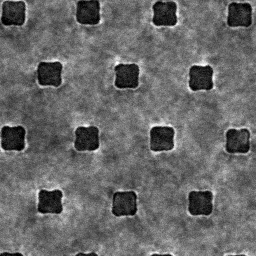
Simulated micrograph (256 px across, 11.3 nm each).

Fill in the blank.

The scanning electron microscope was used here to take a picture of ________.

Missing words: a regular array of holes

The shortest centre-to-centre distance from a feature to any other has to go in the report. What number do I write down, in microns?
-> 0.821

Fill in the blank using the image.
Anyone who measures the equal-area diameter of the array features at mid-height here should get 306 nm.